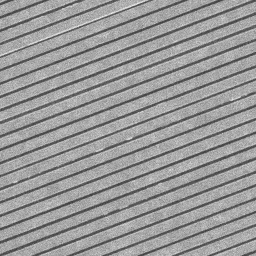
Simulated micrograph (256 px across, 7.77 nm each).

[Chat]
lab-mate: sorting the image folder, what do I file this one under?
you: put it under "parallel lines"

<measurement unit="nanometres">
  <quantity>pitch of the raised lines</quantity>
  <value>96.2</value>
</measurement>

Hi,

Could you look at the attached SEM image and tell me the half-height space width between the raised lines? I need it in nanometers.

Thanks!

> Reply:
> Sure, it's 22.7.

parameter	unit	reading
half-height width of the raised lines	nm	74.5